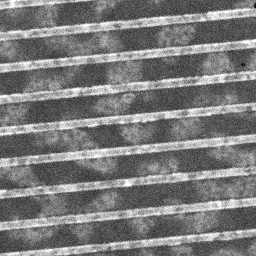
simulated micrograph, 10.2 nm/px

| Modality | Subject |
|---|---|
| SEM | parallel lines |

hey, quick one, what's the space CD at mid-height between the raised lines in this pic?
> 249 nm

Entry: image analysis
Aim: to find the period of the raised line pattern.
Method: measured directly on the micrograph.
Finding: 321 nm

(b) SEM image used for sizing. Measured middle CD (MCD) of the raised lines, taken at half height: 65 nm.